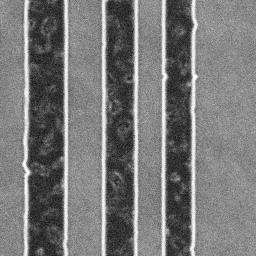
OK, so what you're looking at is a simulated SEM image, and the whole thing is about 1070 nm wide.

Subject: one or a few lines or trenches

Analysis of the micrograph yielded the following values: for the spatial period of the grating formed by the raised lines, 277 nanometers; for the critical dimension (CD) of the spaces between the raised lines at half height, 137 nm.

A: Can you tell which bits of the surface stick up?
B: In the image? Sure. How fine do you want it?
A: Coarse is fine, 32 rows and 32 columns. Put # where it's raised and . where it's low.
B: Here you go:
...#####.....####...####........
...#####.....####...####........
...#####.....####...####........
...#####.....####...####........
...#####.....####...####........
...#####.....####...####........
...#####.....####...####........
...#####.....####...####........
...#####.....####...####........
...#####.....####...####........
...#####.....####...####........
...#####.....####...####........
...#####.....####...####........
...#####.....####...####........
...#####.....####...####........
...#####.....####...####........
...#####.....####...####........
...#####.....####...####........
...#####.....####...####........
...#####.....####...####........
...#####.....####...####........
...#####.....####...####........
...#####.....####...####........
...#####.....####...####........
...#####.....####...####........
...#####.....####...####........
...#####.....####...####........
...#####.....####...####........
...#####.....####...####........
...#####.....####...####........
...#####.....####...####........
...#####.....####...####........